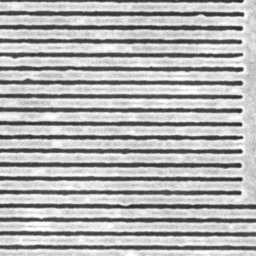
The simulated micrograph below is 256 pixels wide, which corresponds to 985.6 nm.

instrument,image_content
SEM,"parallel lines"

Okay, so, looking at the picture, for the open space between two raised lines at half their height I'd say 18.3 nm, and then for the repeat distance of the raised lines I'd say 0.053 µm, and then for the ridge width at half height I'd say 32.7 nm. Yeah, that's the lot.